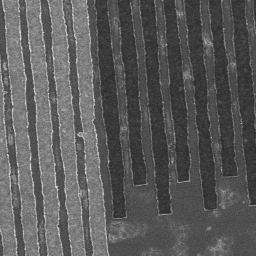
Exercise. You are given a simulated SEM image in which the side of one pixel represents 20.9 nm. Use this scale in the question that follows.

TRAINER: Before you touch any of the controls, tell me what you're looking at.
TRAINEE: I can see parallel lines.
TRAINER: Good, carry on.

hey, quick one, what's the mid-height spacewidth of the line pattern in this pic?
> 171 nanometers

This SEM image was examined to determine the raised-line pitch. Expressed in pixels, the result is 22.6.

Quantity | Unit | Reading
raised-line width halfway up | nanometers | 306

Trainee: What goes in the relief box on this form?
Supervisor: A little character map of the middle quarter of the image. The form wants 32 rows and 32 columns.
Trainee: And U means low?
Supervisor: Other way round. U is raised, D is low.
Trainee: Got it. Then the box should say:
UDDUUUUDDUUUDDDUUUUDUUUUDDUUUUDD
UDDUUUUDDUUUUDDUUUDDUUUUDDUUUUDD
UDDDUUUDDUUUUDDUUUUDDUUUDDUUUUDD
UDDDUUUDDUUUUDDUUUUDDUUUDDUUUUDD
UDDDUUUDDUUUUDDUUUUDDUUUDDUUUUDD
UDDDUUUDDUUUUDDUUUUDDUUUDDUUUUDD
UUDDUUUDDUUUUDDUUUUDDUUUDDUUUUDD
UUDDUUUDDUUUUDDUUUUDDUUUUDUUUUDD
UUDDUUUDDUUUUUDDUUUDDUUUUDDUUUDD
UUDDUUUUDDUUUUDDUUUDDUUUUDDUUUDD
UUDDUUUUDUUUUUDDUUUDDUUUUDDUUUUD
UUDDUUUDDDUUUUDDUUUDDUUUUDDUUUUD
UUDDUUUUDDUUUUDDUUUDDUUUUDDUUUUD
UUDDUUUUDDUUUUDDUUUDDUUUUDDUUUUD
UUDDUUUDDDUUUUDDUUUDDUUUUDDUUUUD
UUDDDUUUDDUUUUDDUUUDDDUUUDDUUUUD
UUUDDUUUDDUUUUDDUUUDDDUUUDDDUUUD
UUUDDUUUDDUUUUDDUUUDDDUUUDDDUUUD
UUUDDUUUDDDUUUDDUUUUDDUUUUDDUUUD
UUUDDUUUDDDUUUDDUUUDDDUUUUDDUUUD
UUUDDUUUDDDUUUDDUUUUDDUUUUDDUUUD
UUUDDUUUDDDUUUUDDUUUDDUUUUDDUUUD
UUUDDUUUDDDUUUUDDUUUDDUUUUDDUUUD
UUUDDUUUUDDUUUUDDUUUDDUUUUDDUUUU
UUUDDUUUUDDUUUUDDUUUDDDUUUDDUUUU
UUUDDUUUUDDUUUUDDUUUDDDUUUDDUUUU
UUUDDUUUUDDUUUUDDUUUDDDUUUDDUUUD
UUUDDDUUUDDDUUUDDUUUUDDUUUDDUUUD
UUUDDDUUUDDDUUUDDUUUUDDUUUDDUUUD
UUUDDDUUUDDDUUUDDUUUUDDUUUDDDDDD
UUUUDDUUUUDDUUUDDDDDDDDUUUDDDDDD
UUUUDDUUUUDDUUUDDDDDDDDUUUDDDDDD